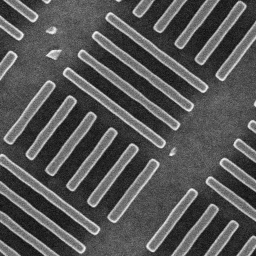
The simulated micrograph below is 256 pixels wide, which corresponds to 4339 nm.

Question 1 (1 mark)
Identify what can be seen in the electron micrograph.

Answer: groups of lines, slits or small figures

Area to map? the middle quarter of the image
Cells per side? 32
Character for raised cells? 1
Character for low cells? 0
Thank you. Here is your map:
00000001110000001111000000111000
11000000111100000111100000011110
11100000011110000001110000001111
01111000000111000000111100000011
00111100000011100000011110000001
00001110000001111000000111000000
00000111000000111100000011110000
00000011110000001110000001111000
01000000111000000111000000011100
11100000011100000001110000001111
11000000001111000000111000000111
11000000000111100000011110000001
10000011000001110000001111000000
00000111000000111100000011100000
00001110000000011110000001110000
00001110000000000111000000111000
00011100000110000011110000000000
00111000001110000001111000000000
01110000011110000000011100000000
11110000011100000000001110000000
11100000111000001100000110000000
11000001110000011100000000000000
11000001110000011100000000000000
10000011100000111000000000000000
00000111000001110000011000000000
00001110000011100000011100000000
00001110000011100000111000000000
00011100000111000001110000000000
00111000001110000011100000000000
01110000011100000111100000000000
01100000111100000111000000000000
00100000111000001110000000000000